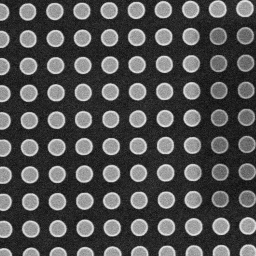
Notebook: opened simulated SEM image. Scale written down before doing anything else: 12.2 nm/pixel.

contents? an array of small figures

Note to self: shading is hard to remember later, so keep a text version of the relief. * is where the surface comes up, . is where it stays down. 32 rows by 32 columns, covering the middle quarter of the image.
...****..****...****...****...**
...****...***...****....***...**
................................
................................
................................
...***....***....***...****...**
...****..*****..****...****...**
...****..*****..****...****...**
...***....***....***....***....*
................................
................................
................................
...***....***....***....***...**
...****...****..*****..****...**
...****...****..****...****...**
...***....***....***....**.....*
................................
................................
........................***....*
...****...****...***...****...**
...****...****...****..****...**
...****...****...***....***...**
....**.....**...................
................................
................................
....**.....**....***....***....*
...****...****...***...****...**
...****...****...****..****...**
...****...****...***....***....*
....**..........................
................................
................................